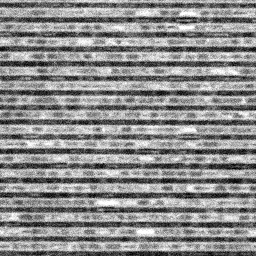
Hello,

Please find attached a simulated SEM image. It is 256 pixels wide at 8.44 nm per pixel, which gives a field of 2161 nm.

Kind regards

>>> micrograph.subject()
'parallel lines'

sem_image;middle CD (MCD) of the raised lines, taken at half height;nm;67.5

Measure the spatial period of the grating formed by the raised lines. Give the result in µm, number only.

0.123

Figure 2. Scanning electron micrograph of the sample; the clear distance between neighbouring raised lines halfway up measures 52.7 nanometres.